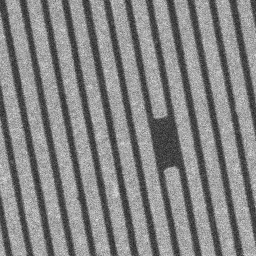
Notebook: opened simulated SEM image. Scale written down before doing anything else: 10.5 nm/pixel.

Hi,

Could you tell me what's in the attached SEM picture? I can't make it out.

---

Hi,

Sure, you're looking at parallel lines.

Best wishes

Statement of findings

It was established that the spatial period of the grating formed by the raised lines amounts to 216 nm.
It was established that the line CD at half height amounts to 0.132 micrometres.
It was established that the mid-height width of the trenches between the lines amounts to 80.2 nanometers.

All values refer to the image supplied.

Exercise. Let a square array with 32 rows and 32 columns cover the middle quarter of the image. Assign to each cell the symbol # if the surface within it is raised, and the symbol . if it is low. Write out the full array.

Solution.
##..####..###..###..###..####..#
###..###..###..###..###...###..#
###..###..###..####..###..###..#
###..###..####.####..###..###..#
###..###..####..###..###..###..#
###..####..###..###..###..####..
####.####..###..###..####..###..
####..###..###..####..###..###..
.###..###..###..####..###..###..
.###..###..####..###..###..###..
.###..####..###..###..###..###..
.###..####..###..###..###...###.
.####..###..###..###..####..###.
..###..###..###..###...#....###.
..###..###..###...###.......###.
..###..####.####..###.......###.
..###..####..###..###........###
..####..###..###..###........###
#..###..###..###..####.......###
#..###..###..###...###.......###
#..###..####.####..###.......###
#..###..####..###..###.......###
#..####..###..###..###........##
##.####..###..###..####.......##
##..###..###..####..###.......##
##..###..###..####..###.......##
##..###...###..###..###..###..##
##..####..###..###..###..####..#
###.####..###..###..###...###..#
###..###..###..####.####..###..#
###..###..###..####..###..###..#
###..###...###..###..###..###..#